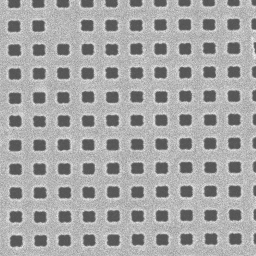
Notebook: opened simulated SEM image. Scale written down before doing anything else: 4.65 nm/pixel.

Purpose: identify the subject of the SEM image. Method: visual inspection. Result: a regular array of holes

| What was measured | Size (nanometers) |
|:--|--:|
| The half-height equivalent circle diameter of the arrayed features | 61.2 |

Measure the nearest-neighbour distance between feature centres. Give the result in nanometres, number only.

110